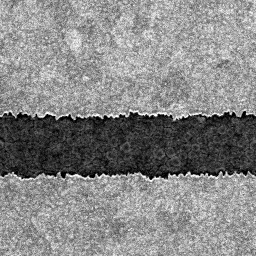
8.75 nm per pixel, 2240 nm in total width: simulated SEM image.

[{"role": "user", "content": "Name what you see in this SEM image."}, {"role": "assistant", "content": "one or a few lines or trenches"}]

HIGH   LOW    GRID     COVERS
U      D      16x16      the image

UUUUUUUUUUUUUUUU
UUUUUUUUUUUUUUUU
UUUUUUUUUUUUUUUU
UUUUUUUUUUUUUUUU
UUUUUUUUUUUUUUUU
UUUUUUUUUUUUUUUU
UUUUUUUUUUUUUUUU
DDDDDDDDDDDDDDDD
DDDDDDDDDDDDDDDD
DDDDDDDDDDDDDDDD
DDDDDDDDDDDDDDDD
UUUUUUUUUUUUUUUU
UUUUUUUUUUUUUUUU
UUUUUUUUUUUUUUUU
UUUUUUUUUUUUUUUU
UUUUUUUUUUUUUUUU